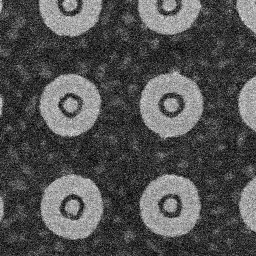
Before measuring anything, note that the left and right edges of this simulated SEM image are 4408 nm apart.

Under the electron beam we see ring-shaped raised bodies with a dot in the middle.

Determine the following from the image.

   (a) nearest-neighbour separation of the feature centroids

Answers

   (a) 1720 nanometers